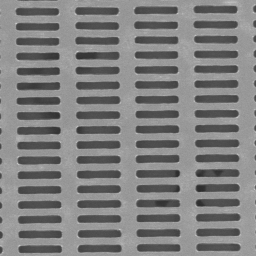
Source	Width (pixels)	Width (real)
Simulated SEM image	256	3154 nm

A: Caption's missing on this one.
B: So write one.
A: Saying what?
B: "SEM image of a regular array of holes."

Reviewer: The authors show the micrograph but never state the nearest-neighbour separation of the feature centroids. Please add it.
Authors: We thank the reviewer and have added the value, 182 nanometers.